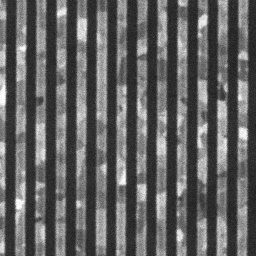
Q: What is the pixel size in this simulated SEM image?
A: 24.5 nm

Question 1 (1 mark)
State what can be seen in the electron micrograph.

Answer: parallel lines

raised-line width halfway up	184	nanometres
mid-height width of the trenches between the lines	318	nm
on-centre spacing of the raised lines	494	nanometres